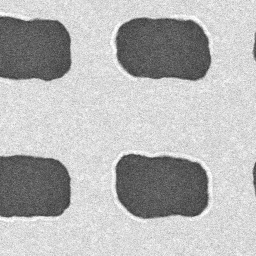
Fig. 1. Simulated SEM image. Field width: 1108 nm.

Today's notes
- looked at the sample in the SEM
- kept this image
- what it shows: holes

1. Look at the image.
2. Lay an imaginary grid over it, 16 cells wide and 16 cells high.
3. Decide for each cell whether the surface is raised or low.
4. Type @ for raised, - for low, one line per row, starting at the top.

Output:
@@@@@@@@@@@@@@@@
----@@@@----@@@@
----@@@------@@@
----@@@------@@@
----@@@@-----@@@
@@@@@@@@@@@@@@@@
@@@@@@@@@@@@@@@@
@@@@@@@@@@@@@@@@
@@@@@@@@@@@@@@@@
@@@@@@@@@@@@@@@@
----@@@------@@@
----@@@------@@@
----@@@------@@@
---@@@@@@---@@@@
@@@@@@@@@@@@@@@@
@@@@@@@@@@@@@@@@